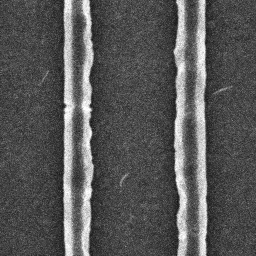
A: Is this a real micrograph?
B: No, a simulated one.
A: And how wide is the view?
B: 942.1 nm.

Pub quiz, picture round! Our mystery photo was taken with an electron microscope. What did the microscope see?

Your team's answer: one or a few lines or trenches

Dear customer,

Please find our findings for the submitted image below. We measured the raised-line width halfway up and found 21.6 px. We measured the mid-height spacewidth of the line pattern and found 338 nm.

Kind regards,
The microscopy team